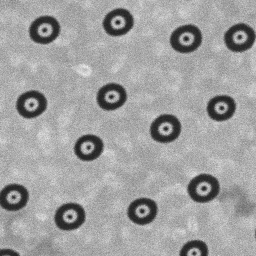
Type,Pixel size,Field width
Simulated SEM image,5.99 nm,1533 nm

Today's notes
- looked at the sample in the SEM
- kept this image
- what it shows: a regular array of ring-shaped grooves with a dot in the middle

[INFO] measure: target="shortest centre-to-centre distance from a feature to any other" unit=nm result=391